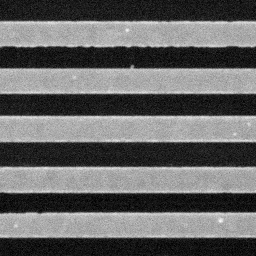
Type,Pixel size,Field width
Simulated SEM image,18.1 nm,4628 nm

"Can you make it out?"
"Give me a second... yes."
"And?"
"lines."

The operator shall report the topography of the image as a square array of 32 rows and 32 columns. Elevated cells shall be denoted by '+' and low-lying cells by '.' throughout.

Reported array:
................................
................................
................................
++++++++++++++++++++++++++++++++
++++++++++++++++++++++++++++++++
++++++++++++++++++++++++++++++++
................................
................................
................................
++++++++++++++++++++++++++++++++
++++++++++++++++++++++++++++++++
++++++++++++++++++++++++++++++++
................................
................................
................................
++++++++++++++++++++++++++++++++
++++++++++++++++++++++++++++++++
++++++++++++++++++++++++++++++++
................................
................................
................................
++++++++++++++++++++++++++++++++
++++++++++++++++++++++++++++++++
++++++++++++++++++++++++++++++++
................................
................................
................................
++++++++++++++++++++++++++++++++
++++++++++++++++++++++++++++++++
++++++++++++++++++++++++++++++++
................................
................................